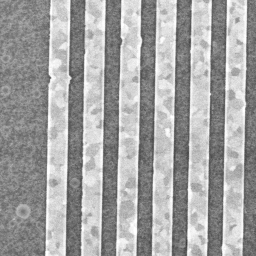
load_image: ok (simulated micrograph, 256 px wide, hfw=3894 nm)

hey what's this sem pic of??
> parallel lines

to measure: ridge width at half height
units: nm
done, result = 283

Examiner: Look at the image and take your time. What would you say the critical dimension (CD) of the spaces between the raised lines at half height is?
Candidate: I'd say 255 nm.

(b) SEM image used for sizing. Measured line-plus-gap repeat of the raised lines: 537 nanometres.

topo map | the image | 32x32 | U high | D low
DDDDDDUUUDDUUDDUUUDDUUDDUUDDUUUD
DDDDDDUUUDDUUDDUUUDDUUDDUUDDUUUD
DDDDDDUUUDDUUDDUUUDDUUDDUUDDUUUD
DDDDDDUUUDDUUDDUUUDDUUDDUUDDUUUD
DDDDDDUUUDDUUDDUUUDDUUDDUUDDUUUD
DDDDDDUUUDDUUDDUUUDDUUDDUUDDUUUD
DDDDDDUUUDDUUDDUUDDDUUDDUUDDUUUD
DDDDDDUUDDDUUDDUUDDDUUDDUUDDUUUD
DDDDDDUUDDDUUDDUUDDDUUDDUUDDUUUD
DDDDDDUUUDDUUDDUUDDDUUDDUUDDUUUD
DDDDDDUUUDDUUDDUUDDDUUDDUUDDUUUD
DDDDDDUUDDDUUDDUUDDDUUDDUUDDUUUD
DDDDDDUUDDDUUDDUUDDUUUDDUUDDUUUD
DDDDDDUUDDDUUDDUUDDUUUDDUUDDUUUD
DDDDDDUUDDDUUDDUUDDUUUDDUUDDUUUD
DDDDDDUUDDDUUDDUUDDUUUDDUUDDUUUD
DDDDDDUUDDDUUDDUUDDUUUDDUUDDUUUD
DDDDDDUUDDDUUDDUUDDUUUDDUUDDUUDD
DDDDDDUUDDUUUDDUUDDUUUDDUUDDUUDD
DDDDDDUUDDUUUDDUUDDUUUDDUUDDUUDD
DDDDDDUUDDUUUDDUUDDUUUDDUUDDUUDD
DDDDDDUUDDUUUDDUUDDUUUDDUUDDUUDD
DDDDDDUUDDUUUDDUUDDUUUDDUUDDUUDD
DDDDDDUUDDUUUDDUUDDUUDDDUUDDUUDD
DDDDDDUUDDUUUDDUUDDUUDDDUUDDUUDD
DDDDDDUUDDUUUDDUUDDUUDDDUUDDUUDD
DDUDDDUUDDUUUDDUUDDUUDDDUUDDUUDD
DDDDDDUUDDUUUDDUUDDUUDDDUUDDUUDD
DDDDDDUUDDUUUDDUUDDUUDDDUUDDUUDD
DDDDDDUUDDUUUDDUUDDUUDDDUUDDUUDD
DDDDDDUUDDUUUDDUUDDUUDDDUUDDUUDD
DDDDDDUUDDUUUDDUUDDUUDDUUUDDUUDD